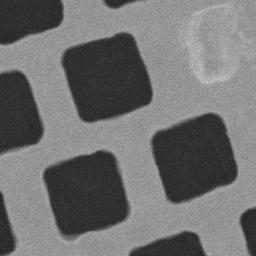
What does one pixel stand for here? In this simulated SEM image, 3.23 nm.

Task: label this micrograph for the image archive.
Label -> holes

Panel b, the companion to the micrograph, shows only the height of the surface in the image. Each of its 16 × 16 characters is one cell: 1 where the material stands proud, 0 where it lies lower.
0000111111111111
0000111111111111
0111110011111111
1111000001111111
0111000001111111
0011000001111111
0011100001111111
0001101111110011
0001111111000011
0111110111000001
1110000111000001
1110000011000011
1110000011101111
1110000011111110
0111001111111110
0111111110000111